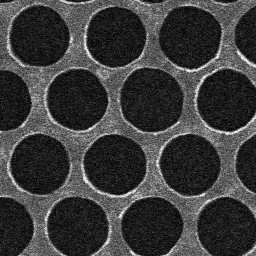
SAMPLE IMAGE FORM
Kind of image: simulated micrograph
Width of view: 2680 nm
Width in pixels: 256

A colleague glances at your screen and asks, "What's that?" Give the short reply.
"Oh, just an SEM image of a regular array of holes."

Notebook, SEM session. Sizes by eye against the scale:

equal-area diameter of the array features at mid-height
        0.644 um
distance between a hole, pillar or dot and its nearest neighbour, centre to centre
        0.769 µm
